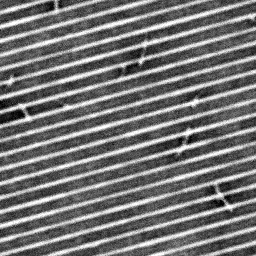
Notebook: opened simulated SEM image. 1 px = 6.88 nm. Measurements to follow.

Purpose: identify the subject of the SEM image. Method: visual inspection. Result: parallel lines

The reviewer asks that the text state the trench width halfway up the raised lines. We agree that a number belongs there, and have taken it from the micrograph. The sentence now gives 74.7 nanometers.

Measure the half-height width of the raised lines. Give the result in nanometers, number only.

19.9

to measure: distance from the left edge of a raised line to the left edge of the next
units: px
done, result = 13.8